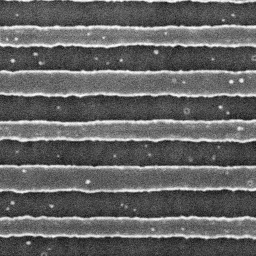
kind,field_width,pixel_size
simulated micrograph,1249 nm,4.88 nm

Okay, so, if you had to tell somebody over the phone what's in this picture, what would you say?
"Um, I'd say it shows lines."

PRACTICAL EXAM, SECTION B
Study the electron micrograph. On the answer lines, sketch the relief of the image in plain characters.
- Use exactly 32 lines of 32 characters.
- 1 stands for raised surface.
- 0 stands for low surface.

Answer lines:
00000000000000000000000000000000
00000000000000000000000000000000
00000000000000000000000000000000
11111111111111111101111111111111
11111111111111111111111111111111
11111111111111111111111111111111
00000000000000000000000000000000
00000000000000000000000000000000
00000000000000000000000000000000
11111111111111111111111111111111
11111111111111111111111111111111
11111111111111111111111111111111
00000000000000000000000000000000
00000000000000000000000000000000
00000000000000000000000000000000
11111111111111111111111111111111
11111111111111111111111111111111
00111000111001111111101111111111
00000000000000000000000000000000
00000000000000000000000000000000
00000000000000000000000000000000
11111111111111111111111111111111
11111111111111111111111111111111
11111111111111111111111111111111
00000000000000000000000000000000
00000000000000000000000000000000
00000000000000000000000000000000
11111111111111111111111111111111
11111111111111111111111111111111
10000110111111011111110111111111
00000000000000000000000000000000
00000000000000000000000000000000